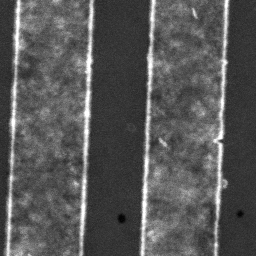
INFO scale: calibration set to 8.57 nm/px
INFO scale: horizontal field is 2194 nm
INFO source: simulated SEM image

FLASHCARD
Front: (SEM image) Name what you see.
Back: one or a few lines or trenches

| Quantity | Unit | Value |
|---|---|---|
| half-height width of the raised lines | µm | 0.63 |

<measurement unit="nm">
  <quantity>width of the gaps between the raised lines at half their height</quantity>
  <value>523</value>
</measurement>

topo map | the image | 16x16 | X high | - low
-XXXXX----XXXX--
-XXXXX----XXXX--
-XXXXX---XXXXX--
-XXXXX---XXXXX--
-XXXXX---XXXXX--
-XXXXX---XXXXX--
-XXXX----XXXXX--
-XXXX----XXXXX--
-XXXX----XXXXX--
-XXXX----XXXXX--
-XXXX----XXXXX--
-XXXX----XXXXX--
-XXXX----XXXXX--
-XXXX----XXXXX--
-XXXX----XXXXX--
-XXXX----XXXXX--